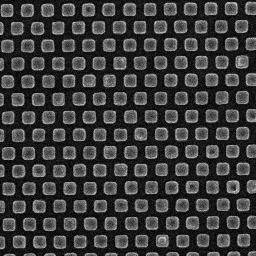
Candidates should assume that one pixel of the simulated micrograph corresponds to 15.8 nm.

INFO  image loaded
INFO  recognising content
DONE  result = a regular array of raised bodies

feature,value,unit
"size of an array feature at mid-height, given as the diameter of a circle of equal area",215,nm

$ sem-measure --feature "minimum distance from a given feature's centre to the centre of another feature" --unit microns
0.319